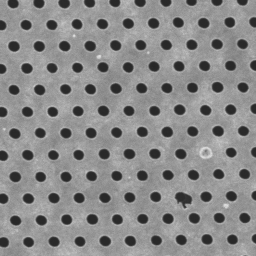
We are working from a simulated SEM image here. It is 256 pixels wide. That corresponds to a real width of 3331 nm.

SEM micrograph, a regular array of holes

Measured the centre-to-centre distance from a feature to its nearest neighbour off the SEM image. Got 323 nanometres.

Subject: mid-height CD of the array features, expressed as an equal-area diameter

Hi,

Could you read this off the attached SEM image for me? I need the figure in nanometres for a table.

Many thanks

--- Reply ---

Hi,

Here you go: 136